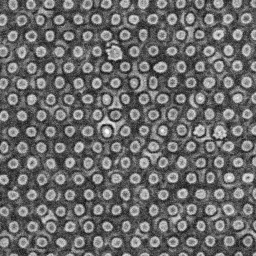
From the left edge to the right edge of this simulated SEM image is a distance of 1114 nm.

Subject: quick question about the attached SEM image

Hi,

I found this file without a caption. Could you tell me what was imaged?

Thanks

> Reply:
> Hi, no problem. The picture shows a regular array of raised bodies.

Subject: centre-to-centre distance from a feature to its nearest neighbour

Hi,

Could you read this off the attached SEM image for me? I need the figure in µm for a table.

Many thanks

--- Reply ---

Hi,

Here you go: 0.0772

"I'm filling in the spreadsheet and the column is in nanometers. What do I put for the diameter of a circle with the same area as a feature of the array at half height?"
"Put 40.8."